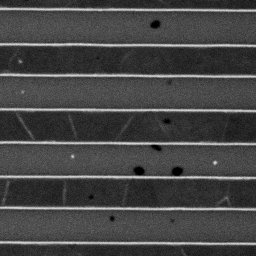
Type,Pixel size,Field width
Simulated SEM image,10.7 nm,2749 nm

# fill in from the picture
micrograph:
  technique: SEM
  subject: wiring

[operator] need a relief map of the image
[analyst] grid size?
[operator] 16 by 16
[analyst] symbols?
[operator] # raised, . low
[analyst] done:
################
................
................
################
################
................
................
################
################
................
................
################
################
................
................
################